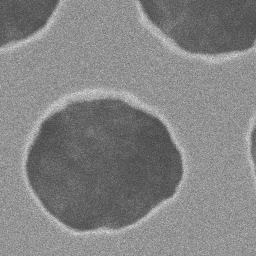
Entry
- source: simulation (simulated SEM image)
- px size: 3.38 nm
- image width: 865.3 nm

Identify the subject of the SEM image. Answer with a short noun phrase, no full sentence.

holes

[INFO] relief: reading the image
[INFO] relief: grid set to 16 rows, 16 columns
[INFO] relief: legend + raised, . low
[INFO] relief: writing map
....+++++.......
...++++++.......
..++++++++......
+++++++++++++.++
++++++++++++++++
++++++++++++++++
++++....++++++++
+++.......++++++
++.........+++++
++.........+++++
++.........+++++
++.........+++++
++........++++++
+++......+++++++
++++++++++++++++
++++++++++++++++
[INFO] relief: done